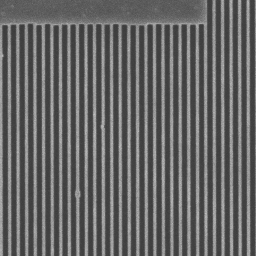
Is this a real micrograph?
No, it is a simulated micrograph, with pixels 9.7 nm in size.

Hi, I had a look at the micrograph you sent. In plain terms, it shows parallel lines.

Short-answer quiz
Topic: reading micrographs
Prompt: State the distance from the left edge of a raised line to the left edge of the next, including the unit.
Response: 82.9 nanometres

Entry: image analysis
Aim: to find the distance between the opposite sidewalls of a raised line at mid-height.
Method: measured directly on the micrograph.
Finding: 27.9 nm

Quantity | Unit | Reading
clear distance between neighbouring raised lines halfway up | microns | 0.0558